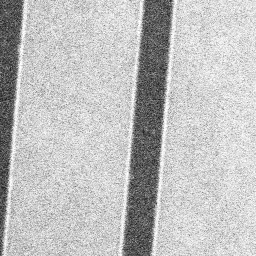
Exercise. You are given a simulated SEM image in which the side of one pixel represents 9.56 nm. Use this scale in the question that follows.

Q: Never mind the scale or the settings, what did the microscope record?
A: one or a few lines or trenches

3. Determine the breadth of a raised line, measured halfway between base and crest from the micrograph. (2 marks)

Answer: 330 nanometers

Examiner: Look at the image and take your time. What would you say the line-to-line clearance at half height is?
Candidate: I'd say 1090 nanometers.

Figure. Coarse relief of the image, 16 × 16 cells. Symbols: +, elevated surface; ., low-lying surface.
++.......++.....
++.......++.....
+........++.....
+........++.....
+.......+++.....
+.......+++.....
+.......++......
+.......++......
+.......++......
+.......++......
+.......++......
+.......++......
+.......++......
+.......++......
........++......
........++......